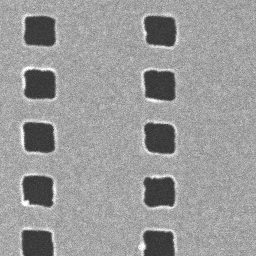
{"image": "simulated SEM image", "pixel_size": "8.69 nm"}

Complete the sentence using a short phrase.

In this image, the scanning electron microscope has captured a regular array of holes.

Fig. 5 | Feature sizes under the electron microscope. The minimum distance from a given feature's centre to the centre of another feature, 461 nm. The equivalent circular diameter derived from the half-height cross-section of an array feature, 294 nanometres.